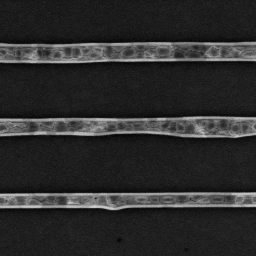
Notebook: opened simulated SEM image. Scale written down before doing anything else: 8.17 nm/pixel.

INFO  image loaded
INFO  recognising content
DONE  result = one or a few lines or trenches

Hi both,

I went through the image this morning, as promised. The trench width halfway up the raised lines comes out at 472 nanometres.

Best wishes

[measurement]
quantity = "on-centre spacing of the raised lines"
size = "604 nanometres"